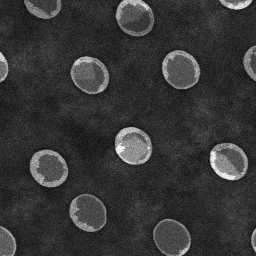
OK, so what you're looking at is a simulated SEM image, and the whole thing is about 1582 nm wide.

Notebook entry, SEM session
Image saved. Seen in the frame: raised bodies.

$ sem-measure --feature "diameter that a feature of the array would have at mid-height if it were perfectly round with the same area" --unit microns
0.228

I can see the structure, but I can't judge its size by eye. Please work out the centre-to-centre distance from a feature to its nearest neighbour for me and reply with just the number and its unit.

507 nm